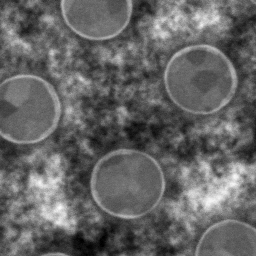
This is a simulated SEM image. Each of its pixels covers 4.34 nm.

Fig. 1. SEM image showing raised bodies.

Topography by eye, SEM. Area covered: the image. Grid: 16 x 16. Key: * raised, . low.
....****........
....****........
................
...........***..
..........*****.
***.......*****.
****.......***..
****............
***.............
.......**.......
......****......
......****......
......****......
................
.............***
............****